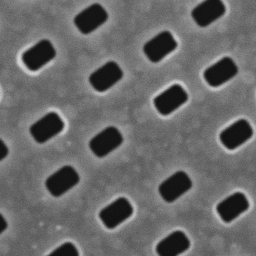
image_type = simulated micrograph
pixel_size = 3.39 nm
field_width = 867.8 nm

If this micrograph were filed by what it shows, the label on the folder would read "a regular array of holes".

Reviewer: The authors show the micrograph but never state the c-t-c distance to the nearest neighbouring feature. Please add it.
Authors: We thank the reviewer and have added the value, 204 nm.